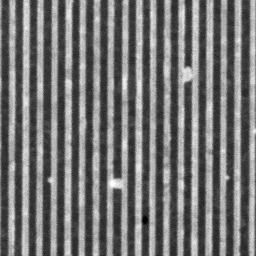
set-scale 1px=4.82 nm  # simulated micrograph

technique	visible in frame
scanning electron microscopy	parallel lines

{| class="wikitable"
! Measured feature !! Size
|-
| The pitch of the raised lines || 68.2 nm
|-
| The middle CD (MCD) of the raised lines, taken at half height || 21.7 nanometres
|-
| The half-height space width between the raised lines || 48.2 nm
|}